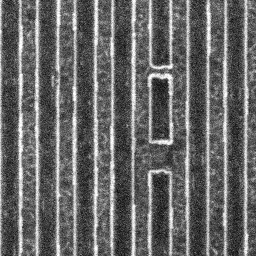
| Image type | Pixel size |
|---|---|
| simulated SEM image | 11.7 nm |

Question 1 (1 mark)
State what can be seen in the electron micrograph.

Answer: parallel lines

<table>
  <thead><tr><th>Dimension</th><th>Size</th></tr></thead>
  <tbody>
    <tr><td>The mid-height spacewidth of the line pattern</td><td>0.231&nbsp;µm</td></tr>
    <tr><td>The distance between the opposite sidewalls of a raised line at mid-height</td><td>209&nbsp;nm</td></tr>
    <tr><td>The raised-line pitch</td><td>440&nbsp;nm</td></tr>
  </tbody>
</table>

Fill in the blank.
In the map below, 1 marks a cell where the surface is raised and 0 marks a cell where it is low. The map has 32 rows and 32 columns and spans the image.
00011001100011000110011000110001
00011001100011000110011000110001
00011001100011000110011000110001
00011001100011000110011000110001
00011001100011000110011000110001
00111001100011000110011000110001
00111001100011000110011000110001
00011001100011000110011000110001
00011001100011000111111000110001
00011001100011000111111000110001
00011001100011000110011000110001
00011001100011000110011000110001
00011001100011000110011000110001
00011001100011000110011000110001
00011001100011000110011000110001
00111001100011000110011000110001
00111001100011000110011000110001
00111001100011000110011000110001
00111001100011000111111000110001
00011001100011000111111000110001
00011001100011000111111000110001
00011001100011000110011000110001
00011001100011000110011100110001
00011001100011000110011000110001
00111001100011000110011000110001
00111001100011000110011000110001
00011001100011000110011000110001
00011001100011000110011000110001
00011001100011000110011000110001
00011001100011000110011000110001
00111001100011000110011000110001
00011001100011000110011000110001